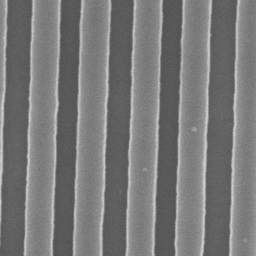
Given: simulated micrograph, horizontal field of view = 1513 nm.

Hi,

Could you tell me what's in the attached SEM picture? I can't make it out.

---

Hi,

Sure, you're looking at lines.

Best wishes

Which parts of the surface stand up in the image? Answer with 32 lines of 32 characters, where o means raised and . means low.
o...oooo..oooo...ooo...ooo....oo
o...oooo..oooo...ooo...ooo....oo
o...oooo..oooo...ooo...ooo....oo
o...ooo...oooo...ooo...ooo....oo
o...ooo...oooo...ooo...ooo....oo
o...ooo...oooo...ooo...ooo....oo
o...ooo...oooo...ooo...ooo....oo
o...ooo...oooo...ooo...ooo...ooo
o...ooo...oooo..oooo...ooo...ooo
o...ooo...oooo..oooo...ooo...ooo
o...ooo...oooo..oooo...ooo...ooo
o...ooo...oooo..oooo..oooo...ooo
o...ooo...ooo...oooo...ooo...ooo
....ooo...ooo...oooo..oooo...ooo
....ooo...ooo...oooo..oooo...ooo
....ooo...ooo...oooo..oooo...ooo
....ooo...ooo...oooo..oooo...ooo
....ooo...ooo...oooo..oooo...ooo
....ooo...ooo...oooo..oooo...ooo
...oooo...ooo...oooo..oooo...ooo
...oooo...ooo...oooo..oooo...ooo
...oooo...ooo...oooo..oooo...ooo
...oooo..oooo...oooo..oooo...ooo
...oooo..oooo...oooo..oooo...ooo
...oooo..oooo...oooo..oooo...ooo
...oooo..oooo...ooo...oooo...ooo
...oooo..oooo...ooo...oooo...ooo
...oooo..oooo...ooo...oooo...ooo
...oooo..oooo...ooo...oooo...ooo
...oooo..oooo...ooo...oooo...ooo
...oooo..oooo...ooo...oooo...ooo
...oooo..oooo...ooo...ooo....ooo